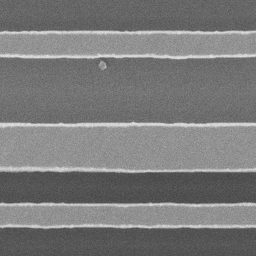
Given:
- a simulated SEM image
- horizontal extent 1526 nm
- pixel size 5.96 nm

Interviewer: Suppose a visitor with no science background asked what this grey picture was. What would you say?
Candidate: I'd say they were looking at lines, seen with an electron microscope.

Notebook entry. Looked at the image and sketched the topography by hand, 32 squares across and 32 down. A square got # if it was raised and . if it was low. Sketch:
................................
................................
................................
................................
################################
################################
################################
................................
................................
................................
................................
................................
................................
................................
................................
###.........########.......#####
################################
################################
################################
################################
################################
...............###..............
................................
................................
................................
#.######..........#.##........##
################################
################################
................................
................................
................................
................................